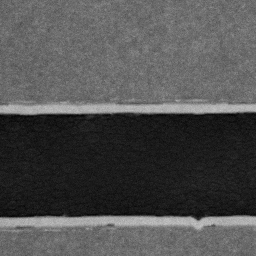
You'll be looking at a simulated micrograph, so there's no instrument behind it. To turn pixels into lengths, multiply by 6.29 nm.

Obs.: one or a few lines or trenches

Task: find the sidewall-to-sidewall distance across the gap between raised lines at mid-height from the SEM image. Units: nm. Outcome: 713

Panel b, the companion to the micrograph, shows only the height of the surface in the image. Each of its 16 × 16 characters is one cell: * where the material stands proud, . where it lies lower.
****************
****************
****************
****************
****************
****************
****************
................
................
................
................
................
................
................
****************
****************